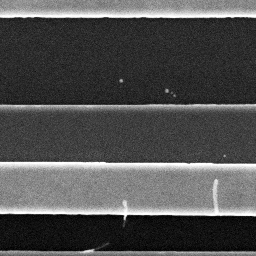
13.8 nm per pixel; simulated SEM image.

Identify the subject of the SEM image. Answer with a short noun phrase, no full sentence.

lines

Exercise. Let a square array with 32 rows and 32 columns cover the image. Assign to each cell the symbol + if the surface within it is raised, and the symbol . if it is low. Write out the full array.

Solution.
++++++++++++++++++++++++++++++++
++++++++++++++++++++++++++++++++
................................
................................
................................
................................
................................
................................
................................
................................
................................
................................
................................
++++++++++++++++++++++++++++++++
++++++++++++++++++++++++++++++++
++++++++++++++++++++++++++++++++
++++++++++++++++++++++++++++++++
++++++++++++++++++++++++++++++++
++++++++++++++++++++++++++++++++
++++++++++++++++++++++++++++++++
++++++++++++++++++++++++++++++++
++++++++++++++++++++++++++++++++
++++++++++++++++++++++++++++++++
++++++++++++++++++++++++++++++++
++++++++++++++++++++++++++++++++
++++++++++++++++++++++++++++++++
++++++++++++++++++++++++++++++++
................................
................................
................................
................................
++++++++++++++++++++++..........